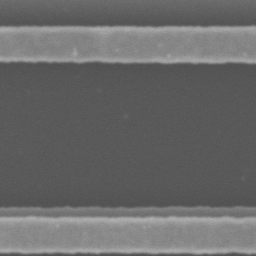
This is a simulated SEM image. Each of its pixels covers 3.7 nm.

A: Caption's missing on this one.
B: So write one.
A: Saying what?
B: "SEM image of lines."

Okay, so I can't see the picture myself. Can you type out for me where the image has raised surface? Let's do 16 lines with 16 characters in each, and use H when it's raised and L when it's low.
HHHHHHHHHHHHHHHH
HHHHHHHHHHHHHHHH
HHHHHHHHHHHHHHHH
HHHHHHHHHHHHHHHH
LLLLLLLLLLLLLLLL
LLLLLLLLLLLLLLLL
LLLLLLLLLLLLLLLL
LLLLLLLLLLLLLLLL
LLLLLLLLLLLLLLLL
LLLLLLLLLLLLLLLL
LLLLLLLLLLLLLLLL
LLLLLLLLLLLLLLLL
LLLLLLLLLLLLLLLL
HHHHHHHHHHHHHHHH
HHHHHHHHHHHHHHHH
HHHHHHHHHHHHHHHH